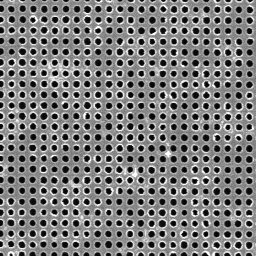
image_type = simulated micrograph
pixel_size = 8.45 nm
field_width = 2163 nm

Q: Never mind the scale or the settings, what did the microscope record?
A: a regular array of holes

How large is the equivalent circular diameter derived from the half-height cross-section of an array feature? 0.0547 µm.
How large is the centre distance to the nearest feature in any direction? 87.9 nm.